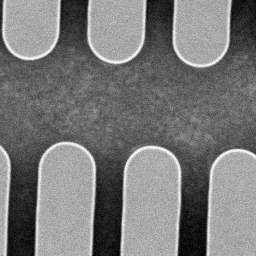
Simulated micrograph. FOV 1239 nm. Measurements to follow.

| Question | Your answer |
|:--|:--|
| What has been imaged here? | groups of lines, slits or small figures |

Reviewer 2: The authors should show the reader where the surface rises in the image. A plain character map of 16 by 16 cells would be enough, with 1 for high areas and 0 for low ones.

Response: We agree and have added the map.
1111001110011100
1111001110011100
1111001110011100
0110001100011100
0000000000000000
0000000000000000
0000000000000000
0000000000000000
0000000000000000
0001100001100011
1011110011100111
1011110011100111
1011110011100111
0011110011100111
0011110011100111
0011110011100111